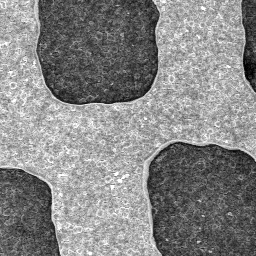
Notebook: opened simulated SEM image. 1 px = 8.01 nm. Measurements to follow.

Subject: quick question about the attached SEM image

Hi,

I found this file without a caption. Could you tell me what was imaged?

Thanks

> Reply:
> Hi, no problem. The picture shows holes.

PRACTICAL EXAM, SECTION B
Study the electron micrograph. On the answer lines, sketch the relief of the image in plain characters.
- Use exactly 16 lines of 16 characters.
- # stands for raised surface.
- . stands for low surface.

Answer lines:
##........#####.
##........#####.
##........#####.
##........#####.
###.......#####.
###......#######
####.###########
################
################
##########.....#
.########.......
...######.......
...######.......
...######.......
...#######......
....######......